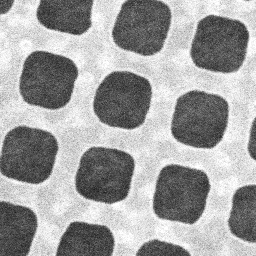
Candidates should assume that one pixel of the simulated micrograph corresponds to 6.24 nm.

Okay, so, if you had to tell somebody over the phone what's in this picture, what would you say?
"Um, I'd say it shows holes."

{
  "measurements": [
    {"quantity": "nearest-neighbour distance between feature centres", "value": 0.481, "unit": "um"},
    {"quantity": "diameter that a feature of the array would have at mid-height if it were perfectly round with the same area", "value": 370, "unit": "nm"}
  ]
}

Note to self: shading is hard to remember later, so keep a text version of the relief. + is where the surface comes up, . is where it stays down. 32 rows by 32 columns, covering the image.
..+++.......+++......+++++++++++
.++++......++++......+++++++++++
+++++......+++.......++++.....++
++++++.....+++.......++++......+
++++++++++++++.......+++.......+
++++++++++++++.......+++.......+
++++..++++++++++....++++.......+
+++......+++++++++++++++.......+
+++.......+++++++++++++++.....++
+++.......+++.....++++++++++++++
++.......+++.......+++++++++++++
++.......+++.......++++...++++++
+++......+++.......+++......++++
+++++...++++.......+++.......+++
++++++++++++......++++.......+++
+++++++++++++.....+++.......+++.
+.....+++++++++++++++.......+++.
.......+++++++++++++++......+++.
.......++++..++++++++++++..++++.
.......+++......+++++++++++++++.
.......+++.......+++++++++++++++
.......+++.......+++.....+++++++
++....+++.......++++......++++++
+++++++++.......+++.......++++..
++++++++++......+++.......+++...
..+++++++++++++++++.......+++...
....+++++++++++++++......++++...
.....++++++++++++++++....+++....
.....+++......+++++++++++++++...
....++++......+++++++++++++++...
....+++.......++++....++++++++++
....+++.......+++......+++++++++